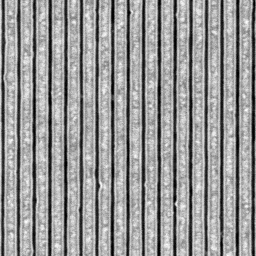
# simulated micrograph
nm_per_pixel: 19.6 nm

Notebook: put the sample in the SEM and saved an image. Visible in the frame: parallel lines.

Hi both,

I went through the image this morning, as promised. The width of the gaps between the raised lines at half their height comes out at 78.5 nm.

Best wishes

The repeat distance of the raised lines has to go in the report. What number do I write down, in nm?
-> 307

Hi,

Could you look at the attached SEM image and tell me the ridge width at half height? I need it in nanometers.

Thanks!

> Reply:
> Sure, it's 216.